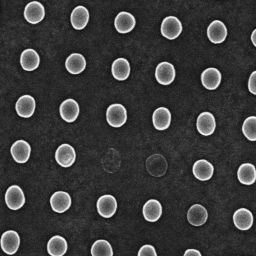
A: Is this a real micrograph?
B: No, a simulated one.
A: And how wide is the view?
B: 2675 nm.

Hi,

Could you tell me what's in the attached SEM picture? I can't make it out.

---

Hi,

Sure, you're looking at a regular array of raised bodies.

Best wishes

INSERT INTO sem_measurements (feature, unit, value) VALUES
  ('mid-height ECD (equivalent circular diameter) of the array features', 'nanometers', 209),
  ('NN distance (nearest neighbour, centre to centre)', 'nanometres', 472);